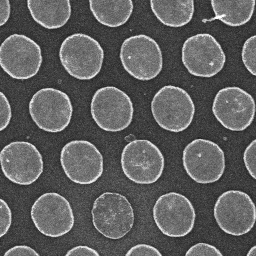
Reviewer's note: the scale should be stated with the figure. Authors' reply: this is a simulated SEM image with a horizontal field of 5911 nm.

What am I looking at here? a regular array of raised bodies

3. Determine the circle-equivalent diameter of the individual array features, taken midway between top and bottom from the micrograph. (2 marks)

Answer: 984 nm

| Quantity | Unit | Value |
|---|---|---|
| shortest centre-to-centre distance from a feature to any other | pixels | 60.4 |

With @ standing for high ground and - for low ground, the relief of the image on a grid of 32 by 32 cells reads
@---@@@@@--@@@@@@--@@@@@---@@@@@
@---@@@@@---@@@@---@@@@@---@@@@@
@---@@@@----@@@@----@@@@----@@@-
--------------------------------
-@@------@@------@------@@------
@@@@@---@@@@---@@@@@---@@@@----@
@@@@@---@@@@@--@@@@@---@@@@@--@@
@@@@@---@@@@@--@@@@@---@@@@@--@@
@@@@@---@@@@@---@@@@---@@@@@---@
-@@@-----@@@-----@@------@------
--------------------------------
-----@@@----@@@-----@@@----@@@@-
@---@@@@@---@@@@---@@@@@---@@@@@
@---@@@@@---@@@@@--@@@@@---@@@@@
@---@@@@@---@@@@@--@@@@@---@@@@@
@----@@@----@@@@----@@@@----@@@-
--------------------------------
-------------------------@------
-@@@----@@@@----@@@@---@@@@----@
@@@@@---@@@@@--@@@@@---@@@@@---@
@@@@@---@@@@@--@@@@@---@@@@@---@
@@@@@---@@@@@--@@@@@---@@@@@---@
-@@@-----@@@----@@@@----@@@-----
--------------------------------
-----@@@------------@@@-----@@@-
@---@@@@@----------@@@@@---@@@@@
@---@@@@@----------@@@@@---@@@@@
@---@@@@@----------@@@@@---@@@@@
@----@@@@-----------@@@@----@@@-
---------------------@@---------
--------------------------------
-@@@-----@@@----@@@@---@@@@----@